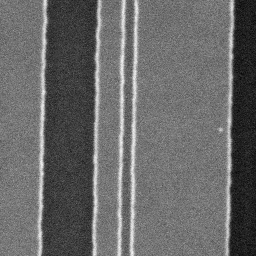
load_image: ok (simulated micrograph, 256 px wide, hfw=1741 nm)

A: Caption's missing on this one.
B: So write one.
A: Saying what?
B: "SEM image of lines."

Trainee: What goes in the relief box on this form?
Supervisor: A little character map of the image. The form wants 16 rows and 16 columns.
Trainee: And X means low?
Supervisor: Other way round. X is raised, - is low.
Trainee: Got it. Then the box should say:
XXX---XXXXXXXXX-
XXX---XXXXXXXXX-
XXX---XXXXXXXX--
XXX---XXXXXXXX--
XXX---XXXXXXXX--
XXX---XXXXXXXX--
XXX---XXXXXXXX--
XXX---XXXXXXXX--
XXX---XXXXXXXX--
XXX---XXXXXXXX--
XXX---XXXXXXXX--
XXX---XXXXXXXX--
XXX---XXXXXXXX--
XXX---XXXXXXXX--
XXX---XXXXXXXX--
XXX---XXXXXXXX--